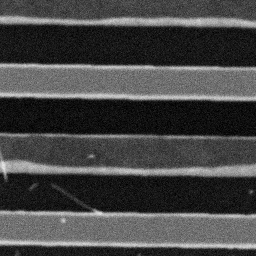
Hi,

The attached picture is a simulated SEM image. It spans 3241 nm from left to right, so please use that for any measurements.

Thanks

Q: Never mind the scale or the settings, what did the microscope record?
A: lines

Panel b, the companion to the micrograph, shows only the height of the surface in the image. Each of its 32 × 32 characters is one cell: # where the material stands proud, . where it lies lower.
################################
################################
################################
................................
................................
................................
................................
................................
############################....
################################
################################
################################
.............................###
................................
................................
................................
................................
################################
################################
################################
################################
..........######################
................................
................................
................................
................................
#.#.............................
################################
################################
################################
.###############################
................................